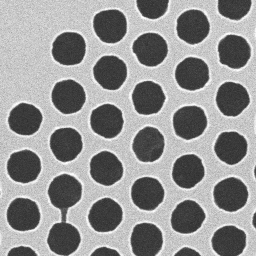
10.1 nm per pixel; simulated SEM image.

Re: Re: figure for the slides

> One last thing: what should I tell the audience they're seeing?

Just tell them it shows a regular array of holes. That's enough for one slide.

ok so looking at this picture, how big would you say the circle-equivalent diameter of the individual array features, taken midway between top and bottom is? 34.2 px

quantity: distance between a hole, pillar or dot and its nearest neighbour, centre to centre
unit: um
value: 0.472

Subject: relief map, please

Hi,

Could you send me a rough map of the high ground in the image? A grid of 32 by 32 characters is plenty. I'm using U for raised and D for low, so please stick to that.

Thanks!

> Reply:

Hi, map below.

UUUUUUUUUUUUUUUUUDDDDUUUUUUDDDDU
UUUUUUUUUUUUDDDUUDDDDUUDDUUDDDDU
UUUUUUUUUUUUDDDDUUUUUUDDDDUUUUUU
UUUUUUUUUUUUDDDDUUUUUUDDDDUUUUUU
UUUUUUUDDDUUDDDDUDDDUUDDDDUUDDUU
UUUUUUUDDDDUUUUUUDDDDUUUDUUDDDDU
UUUUUUDDDDDUUUUUUDDDDUUUUUUDDDDU
UUUUUUUDDDUUDDDUUDDDUUUDDUUDDDDU
UUUUUUUUUUUUDDDDUUUUUUDDDDUUUDUU
UUUUUUUUUUUUDDDDUUUUUUDDDDUUUUUU
UUUUUUUDDDUUDDDUUDDDUUDDDDUUDDUU
UUUUUUDDDDDUUUUUUDDDUUUUUUUDDDDU
UUUUUUDDDDDUUUUUUDDDDUUUUUUDDDDU
UUDDDUUDDDUUDDDUUDDDUUUDDUUDDDDU
UDDDDUUUUUUDDDDUUUUUUUDDDDUUDUUU
UDDDDUUUUUUDDDDUUUUUUUDDDDUUUUUU
UUDDUUUDDDUUDDDUUDDDUUDDDUUUDUUU
UUUUUUDDDDUUUUUUUDDDDUUUUUUDDDDU
UUUUUUDDDDUUUUUUUDDDDUUUUUUDDDDU
UDDDDUUDDDUUDDUUUDDDUUUDDUUDDDDU
UDDDDUUUUUUDDDDUUUUUUUDDDUUUDUUU
UDDDDUUUUUUDDDDUUUUUUUDDDDUUUUUU
UUDDUUUDDDUUDDDUUDDDUUDDDUUUDDUU
UUUUUUDDDDUUUUUUDDDDUUUDUUUDDDDU
UUUUUUDDDDUUUUUUDDDDDUUUUUUDDDDU
UDDDUUUDDUUUDDDUUDDDUUDDDUUDDDDU
UDDDDUUUUUUDDDDUUUUUUUDDDUUUUUUU
UDDDDUUUUUUDDDDUUUUUUDDDDDUUUUUU
UUDDUUDDDUUUDDDUUDDDUUDDDUUUDDUU
UUUUUUDDDDUUUUUUDDDDUUUUUUUDDDDU
UUUUUUDDDDUUUUUUDDDDUUUUUUDDDDDU
UDDDUUUDDUUUDDDUUDDDUUDDDUUDDDUU